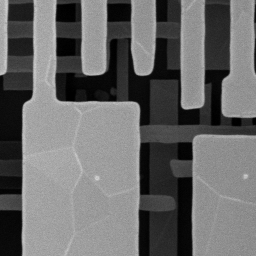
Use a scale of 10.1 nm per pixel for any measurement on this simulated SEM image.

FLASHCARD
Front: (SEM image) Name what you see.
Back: wiring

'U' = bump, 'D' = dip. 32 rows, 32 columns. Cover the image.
UDDDUUUDDDUUUDDDUUUDDDDUUUDDDUUU
UDDDUUUDDDUUUDDDUUUDDDDUUUDDDUUU
UDDDUUUDDDUUUDDDUUUDDDDUUUDDDUUU
UDDDUUUDDDUUUDDDUUUDDDDUUUDDDUUU
UDDDUUUDDDUUUDDDUUUDDDDUUUDDDUUU
UDDDUUUDDDUUUDDDUUUDDDDUUUDDDUUU
UDDDUUUDDDUUUDDDUUUDDDDUUUDDDUUU
UDDDUUUDDDUUUDDDDUUDDDDUUUDDDUUU
UDDDUUUDDDUUUDDDDUUDDDDUUUDDDUUU
DDDDUUUDDDDDDDDDDDDDDDDUUUDDUUUU
DDDDUUUDDDDDDDDDDDDDDDDUUUDDUUUU
DDDDUUUDDDDDDDDDDDDDDDDUUUDDUUUU
DDDDUUUDDDDDDDDDDDDDDDDUUUDDUUUU
DDDUUUUUUUUUUUUUUDDDDDDUDDDDUUUU
DDDUUUUUUUUUUUUUUDDDDDDDDDDDUUUU
DDDUUUUUUUUUUUUUUDDDDDDDDDDDDDDD
DDDUUUUUUUUUUUUUUDDDDDDDDDDDDDDD
DDDUUUUUUUUUUUUUUUDDDDDDUUUUUUUU
DDDUUUUUUUUUUUUUUUDDDDDDUUUUUUUU
DDDUUUUUUUUUUUUUUDDDDDDDUUUUUUUU
DDDUUUUUUUUUUUUUUDDDDDDDUUUUUUUU
DDDUUUUUUUUUUUUUUDDDDDDDUUUUUUUU
DDDUUUUUUUUUUUUUUDDDDDDDUUUUUUUU
DDDUUUUUUUUUUUUUUDDDDDDDUUUUUUUU
DDDUUUUUUUUUUUUUUDDDDDDDUUUUUUUU
DDDUUUUUUUUUUUUUUDDDDDDDUUUUUUUU
DDDUUUUUUUUUUUUUUDDDDDDDUUUUUUUU
DDDUUUUUUUUUUUUUUDDDDDDDUUUUUUUU
DDDUUUUUUUUUUUUUUDDDDDDDUUUUUUUU
DDDUUUUUUUUUUUUUUDDDDDDDUUUUUUUU
DDDUUUUUUUUUUUUUUDDDDDDDUUUUUUUU
DDDUUUUUUUUUUUUUUDDDDDDDUUUUUUUU